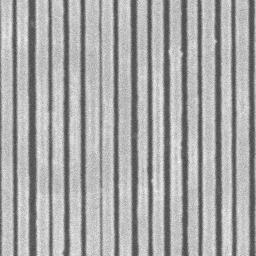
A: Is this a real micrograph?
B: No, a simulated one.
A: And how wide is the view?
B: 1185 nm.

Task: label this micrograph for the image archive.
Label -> parallel lines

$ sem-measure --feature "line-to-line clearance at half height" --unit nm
27.2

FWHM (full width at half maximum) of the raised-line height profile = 48.6 nm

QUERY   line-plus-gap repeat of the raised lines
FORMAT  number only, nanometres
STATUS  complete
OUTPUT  77.9